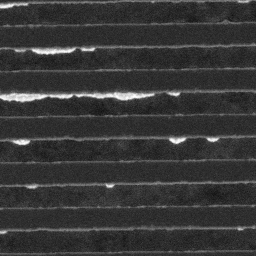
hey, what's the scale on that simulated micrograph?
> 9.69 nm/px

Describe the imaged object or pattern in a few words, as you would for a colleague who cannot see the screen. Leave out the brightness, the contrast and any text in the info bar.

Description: lines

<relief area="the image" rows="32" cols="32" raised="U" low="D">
UDDDDDDDDDDDDDDDDDDDDDDDDDDDDDDD
DDDDDDDDDDDDDDDDDDDDDDDDDDDDDDDD
DDDDDDDDDDDDDDDDDDDDDDDDDDDDDDDD
UUUUUUUUUUUUUUUUUUUUUUUUUUUUUUUU
UUUUUUUUUUUUUUUUUUUUUUUUUUUUUUUU
UUUUUUUUUUUUUUUUUUUUUUUUUUUUUUUU
DDDDDUUDDDDDDDDDDDDDDDDDDDDDDDDD
DDDDDDDDDDDDDDDDDDDDDDDDDDDDDDDD
DDDDDDDDDDDDDDDDDDDDDDDDDDDDDDDD
UUUUUUUUUUUUUUUUUUUUUUUUUUUUUUUU
UUUUUUUUUUUUUUUUUUUUUUUUUUUUUUUU
UUUUUUUUUUUUUUUUUUUUUDDDDDDDDDDD
DDUUDDDDDDDDDDDDDDDDDDDDDDDDDDDD
DDDDDDDDDDDDDDDDDDDDDDDDDDDDDDDD
DDDDDDDDDDUUDUUUUUUUUUUUUUUUUUUU
UUUUUUUUUUUUUUUUUUUUUUUUUUUUUUUU
UUUUUUUUUUUUUUUUUUUUUUUUUUUUUUUU
UUUUDDDDDUUDDDDDDDDDDUUDDDDDDDDD
DDDDDDDDDDDDDDDDDDDDDDDDDDDDDDDD
DDDDDDDDDDDDDDDDDDDDDDDDDDDDDDDD
UUUUUUUUUUUUUUUUUUUUUUUUUUUUUUUU
UUUUUUUUUUUUUUUUUUUUUUUUUUUUUUUU
UUUUUUUUUUUUUUUUUUUUUUUUUUUUUUUU
DDDDDDDDDDDDDDDDDDDDDDDDDDDDDDDD
DDDDDDDDDDDDDDDDDDDDDDDDDDDDDDDD
DDDDDDDDDDDDDDDDDDDDDDDDDDDDDDDD
UUUUUUUUUUUUUUUUUUUUUUUUUUUUUUUU
UUUUUUUUUUUUUUUUUUUUUUUUUUUUUUUU
UUUUUUUUUUUUUUUUUUUUUUUUUUUUUUDD
DDDDDDDDDDDDDDDDDDDDDDDDDDDDDDDD
DDDDDDDDDDDDDDDDDDDDDDDDDDDDDDDD
DDDDDDDDDDDDDDDDDDDDDUDUUUUUUUUU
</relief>